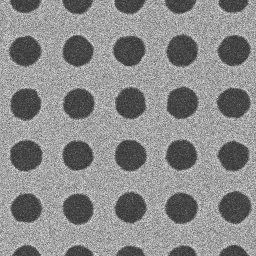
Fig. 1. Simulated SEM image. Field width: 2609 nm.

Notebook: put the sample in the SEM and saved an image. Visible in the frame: a regular array of holes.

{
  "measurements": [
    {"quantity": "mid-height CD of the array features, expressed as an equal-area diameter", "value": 0.323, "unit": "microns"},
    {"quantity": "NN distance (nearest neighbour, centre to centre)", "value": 524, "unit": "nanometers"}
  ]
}